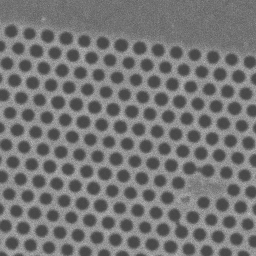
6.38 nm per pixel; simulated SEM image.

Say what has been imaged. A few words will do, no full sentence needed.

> a regular array of holes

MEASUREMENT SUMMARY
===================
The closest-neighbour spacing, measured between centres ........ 0.117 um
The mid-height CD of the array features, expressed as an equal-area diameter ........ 0.0786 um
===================